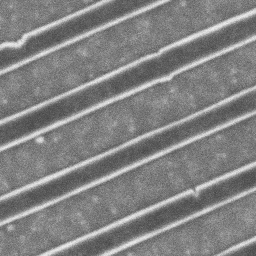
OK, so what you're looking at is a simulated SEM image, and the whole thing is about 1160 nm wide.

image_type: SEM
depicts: one or a few lines or trenches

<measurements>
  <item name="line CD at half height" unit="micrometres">0.113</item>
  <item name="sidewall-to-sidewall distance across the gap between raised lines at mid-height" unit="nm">201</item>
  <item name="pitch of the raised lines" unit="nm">316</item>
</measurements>